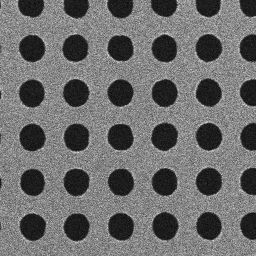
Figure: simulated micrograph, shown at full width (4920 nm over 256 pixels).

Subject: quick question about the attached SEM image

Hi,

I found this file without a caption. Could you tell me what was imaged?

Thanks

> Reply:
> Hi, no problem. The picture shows a regular array of holes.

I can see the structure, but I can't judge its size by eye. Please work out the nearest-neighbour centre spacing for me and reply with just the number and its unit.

0.842 micrometres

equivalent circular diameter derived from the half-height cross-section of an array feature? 26.8 pixels